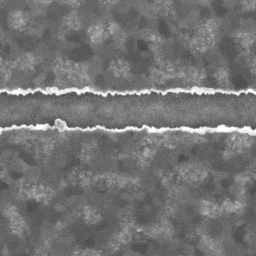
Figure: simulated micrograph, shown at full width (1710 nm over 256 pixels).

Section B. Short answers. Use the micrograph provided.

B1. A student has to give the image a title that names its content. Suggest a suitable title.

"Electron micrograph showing one or a few lines or trenches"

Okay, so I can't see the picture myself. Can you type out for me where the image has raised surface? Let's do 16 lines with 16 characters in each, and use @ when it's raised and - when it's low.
@@@@@@@@@@@@@@@@
@@@@@@@@@@@@@@@@
@@@@@@@@@@@@@@@@
@@@@@@@@@@@@@@@@
@@@@@@@@@@@@@@@@
@@@@@@@@@@@@@@@@
----------------
----------------
@@@@@@@@@@@@@@@@
@@@@@@@@@@@@@@@@
@@@@@@@@@@@@@@@@
@@@@@@@@@@@@@@@@
@@@@@@@@@@@@@@@@
@@@@@@@@@@@@@@@@
@@@@@@@@@@@@@@@@
@@@@@@@@@@@@@@@@